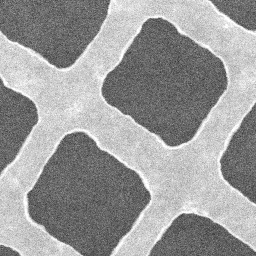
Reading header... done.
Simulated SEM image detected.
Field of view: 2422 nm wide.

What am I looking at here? holes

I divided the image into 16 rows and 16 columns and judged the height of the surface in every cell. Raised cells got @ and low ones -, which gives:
-------@@@@@@---
------@@@--@@@@-
@-----@@----@@@@
@@---@@@------@@
@@@@@@@-------@@
-@@@@@--------@@
--@@@@@------@@@
--@@@@@@-----@@-
--@@--@@@@--@@--
-@@----@@@@@@@--
@@@-----@@@@@@--
@@-------@@@@@--
@@-------@@@@@@@
@@-------@@--@@@
@@@-----@@----@@
-@@@---@@@------